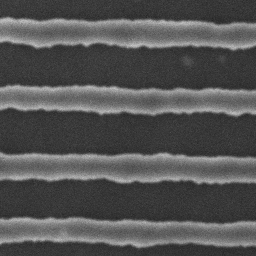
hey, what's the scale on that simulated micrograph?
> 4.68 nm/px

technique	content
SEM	lines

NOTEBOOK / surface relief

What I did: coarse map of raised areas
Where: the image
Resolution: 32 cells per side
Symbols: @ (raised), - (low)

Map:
--------------------------------
--------------------------------
@@@@--@@-------@--@-------------
@@@@@@@@@@@@@@@@@@@@@@@@@@@@@@@@
@@@@@@@@@@@@@@@@@@@@@@@@@@@@@@@@
---@@@@-@@@---@@@@@@@@@@@@@@@@@@
--------------------------------
--------------------------------
--------------------------------
--------------------------------
--------------------------------
@@@@@@@@@@@@@@@@@@@@@@@@@@@@@@@@
@@@@@@@@@@@@@@@@@@@@@@@@@@@@@@@@
@-@@@@@@@@@@@@@@@@@@@@@@@@@@@@@@
--------------------------------
--------------------------------
--------------------------------
--------------------------------
--------------------------------
@@@@@@@@@@@@@@@@@@@@@@@---------
@@@@@@@@@@@@@@@@@@@@@@@@@@@@@@@@
@@@@@@@@@@@@@@@@@@@@@@@@@@@@@@@@
------@-------@@@@@@-@@-@@@@@@@@
--------------------------------
--------------------------------
--------------------------------
--------------------------------
@@@@@@@@@@@---------------------
@@@@@@@@@@@@@@@@@@@@@@@@@@@@@@@@
@@@@@@@@@@@@@@@@@@@@@@@@@@@@@@@@
--------------@@@@@@-----@@@@@@@
--------------------------------